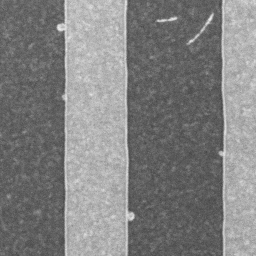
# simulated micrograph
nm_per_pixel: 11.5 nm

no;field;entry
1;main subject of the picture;one or a few lines or trenches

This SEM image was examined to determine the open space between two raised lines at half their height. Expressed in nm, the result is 1120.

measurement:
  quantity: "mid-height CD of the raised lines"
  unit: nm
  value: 704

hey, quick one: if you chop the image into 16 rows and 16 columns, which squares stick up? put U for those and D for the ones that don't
DDDDUUUUDDDDDDUU
DDDDUUUUDDDDDDUU
DDDDUUUUDDDDDDUU
DDDDUUUUDDDDDDUU
DDDDUUUUDDDDDDUU
DDDDUUUUDDDDDDUU
DDDDUUUUDDDDDDUU
DDDDUUUUDDDDDDUU
DDDDUUUUDDDDDDUU
DDDDUUUUDDDDDDUU
DDDDUUUUDDDDDDUU
DDDDUUUUDDDDDDUU
DDDDUUUUDDDDDDUU
DDDDUUUUDDDDDDUU
DDDDUUUUDDDDDDUU
DDDDUUUUDDDDDDUU